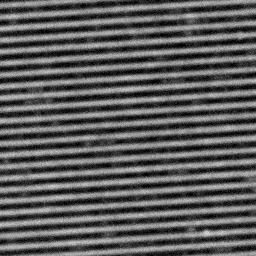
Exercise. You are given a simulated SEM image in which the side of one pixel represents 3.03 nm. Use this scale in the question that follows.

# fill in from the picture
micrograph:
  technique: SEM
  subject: parallel lines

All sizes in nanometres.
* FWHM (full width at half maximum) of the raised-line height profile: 11.7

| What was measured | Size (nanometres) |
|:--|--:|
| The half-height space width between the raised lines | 23.4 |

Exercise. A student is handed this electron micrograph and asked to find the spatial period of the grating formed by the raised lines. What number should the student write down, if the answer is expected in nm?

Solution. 34.9